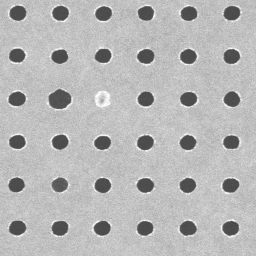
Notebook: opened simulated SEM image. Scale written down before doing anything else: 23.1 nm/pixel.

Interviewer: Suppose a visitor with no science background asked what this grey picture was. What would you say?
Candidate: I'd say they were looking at a regular array of holes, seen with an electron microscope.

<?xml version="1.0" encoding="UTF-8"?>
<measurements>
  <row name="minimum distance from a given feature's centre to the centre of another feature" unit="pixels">42.5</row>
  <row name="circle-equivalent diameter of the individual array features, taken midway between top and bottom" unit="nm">370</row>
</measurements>